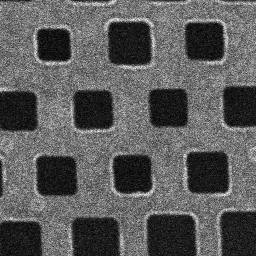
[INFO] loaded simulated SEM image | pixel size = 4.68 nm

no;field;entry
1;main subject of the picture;a regular array of holes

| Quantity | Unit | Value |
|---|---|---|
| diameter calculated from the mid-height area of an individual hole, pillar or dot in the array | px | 43.2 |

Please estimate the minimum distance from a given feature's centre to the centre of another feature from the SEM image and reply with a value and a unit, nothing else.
352 nm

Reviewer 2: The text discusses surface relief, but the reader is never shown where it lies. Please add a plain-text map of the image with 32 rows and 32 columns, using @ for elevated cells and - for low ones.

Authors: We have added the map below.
@@@@@@@@@@@@@@@@@@@@@@@@@@@@@@@@
@@@@@@@@@@@@@@@@@@@@@@@@@@@@@@@@
@@@@@@@@@@@@@@@@@@@@@@@@@@@@@@@@
@@@@@@@@@@@@@@-----@@@@-----@@@@
@@@@@----@@@@@-----@@@@-----@@@@
@@@@@----@@@@------@@@@-----@@@@
@@@@@----@@@@------@@@@-----@@@@
@@@@@---@@@@@@-----@@@@@---@@@@@
@@@@@@@@@@@@@@@@@@@@@@@@@@@@@@@@
@@@@@@@@@@@@@@@@@@@@@@@@@@@@@@@@
@@@@@@@@@@@@@@@@@@@@@@@@@@@@@@@@
----@@@@@-----@@@@@----@@@@@----
-----@@@@-----@@@@@----@@@@@----
-----@@@@-----@@@@@----@@@@@----
-----@@@@-----@@@@@-----@@@@----
-----@@@@-----@@@@@----@@@@@----
@@@@@@@@@@@@@@@@@@@@@@@@@@@@@@@@
@@@@@@@@@@@@@@@@@@@@@@@@@@@@@@@@
@@@@@@@@@@@@@@@@@@@@@@@@@@@@@@@@
@@@@@---@@@@@@@---@@@@@-----@@@@
@@@@@-----@@@@-----@@@@------@@@
@@@@@-----@@@@-----@@@@------@@@
@@@@@-----@@@@-----@@@@------@@@
@@@@@-----@@@@-----@@@@------@@@
@@@@@@---@@@@@@@@@@@@@@@@@@@@@@@
@@@@@@@@@@@@@@@@@@@@@@@@@@@@@@@@
@@@@@@@@@@@@@@@@@@@@@@@@@@@@----
@@@@@@@@@-----@@@@------@@@-----
-----@@@@------@@@------@@@-----
-----@@@@------@@@-------@@-----
-----@@@@------@@@-------@@@----
-----@@@@------@@@-------@@@----